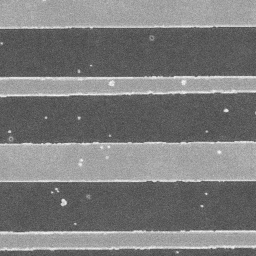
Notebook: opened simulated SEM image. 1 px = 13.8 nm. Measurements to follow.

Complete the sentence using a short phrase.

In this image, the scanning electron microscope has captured lines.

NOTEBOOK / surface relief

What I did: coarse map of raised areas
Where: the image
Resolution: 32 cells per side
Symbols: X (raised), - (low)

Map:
XXXXXXXXXXXXXXXXXXXXXXXXXXXXXXXX
XXXXXXXXXXXXXXXXXXXXXXXXXXXXXXXX
XXXXXXXXXXXXXXXXXXXXXXXXXXXXXXXX
--------------------------------
--------------------------------
--------------------------------
--------------------------------
--------------------------------
--------------------------------
--------------------------------
XXXXXXXXXXXXXXXXXXXXXXXXXXXXXXXX
XXXXXXXXXXXXXXXXXXXXXXXXX-------
--------------------------------
--------------------------------
--------------------------------
--------------------------------
--------------------------------
--------------------------------
XXXXXXXXXXXXXXXXXXXXXXXXXXXXXXXX
XXXXXXXXXXXXXXXXXXXXXXXXXXXXXXXX
XXXXXXXXXXXXXXXXXXXXXXXXXXXXXXXX
XXXXXXXXXXXXXXXXXXXXXXXXXXXXXXXX
XXXXXXXXXXXXXXXXXXXXXXXXXXXXXXXX
--------------------------------
--------------------------------
--------------------------------
--------------------------------
--------------------------------
--------------------------------
XXXXXXXXXXXXXXXXXXXXXXXXXXXXXXXX
XXXXXXXXXXXXXXXXXXXXXXXXXXXXXXXX
--------------------------------